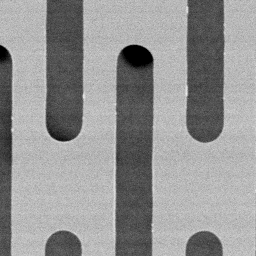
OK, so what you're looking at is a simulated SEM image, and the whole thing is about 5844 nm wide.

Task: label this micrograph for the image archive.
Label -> groups of lines, slits or small figures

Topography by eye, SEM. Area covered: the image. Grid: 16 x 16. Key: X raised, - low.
XXX--XXXXXXX--XX
XXX--XXXXXXX--XX
XXX--XXXXXXX--XX
-XX--XX--XXX--XX
-XX--XX---XX--XX
-XX--XX---XX--XX
-XX--XX---XX--XX
-XX--XX---XX--XX
-XX--XX---XX--XX
-XXXXXX---XXXXXX
-XXXXXX---XXXXXX
-XXXXXX---XXXXXX
-XXXXXX---XXXXXX
-XXXXXX---XXXXXX
-XXXXXX---XX-XXX
-XX--XX---XX--XX